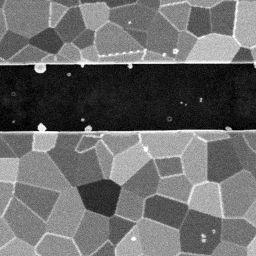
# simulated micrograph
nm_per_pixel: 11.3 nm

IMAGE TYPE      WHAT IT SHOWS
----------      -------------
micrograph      wiring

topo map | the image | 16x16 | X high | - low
XXXXXXXXXXXXXXXX
XXXXXXXXXXXXXXXX
XXXXXXXXXXXXXXXX
XXXXXXXXXXXXXXXX
----------------
----------------
----------------
----------------
XXXXXXXXXXXXXXXX
XXXXXXXXXXXXXXXX
XXXXXXXXXXXXXXXX
XXXXXXXXXXXXXXXX
XXXXXXXXXXXXXXXX
XXXXXXXXXXXXXXXX
XXXXXXXXXXXXXXXX
XXXXXXXXXXXXXXXX